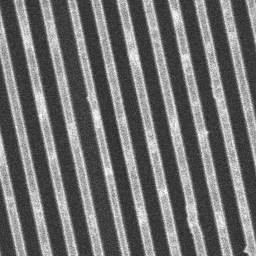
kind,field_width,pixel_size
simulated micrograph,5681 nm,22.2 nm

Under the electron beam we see parallel lines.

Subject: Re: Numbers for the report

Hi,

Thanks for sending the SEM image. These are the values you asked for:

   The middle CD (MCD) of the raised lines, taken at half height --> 244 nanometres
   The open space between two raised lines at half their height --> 317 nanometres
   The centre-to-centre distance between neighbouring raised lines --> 559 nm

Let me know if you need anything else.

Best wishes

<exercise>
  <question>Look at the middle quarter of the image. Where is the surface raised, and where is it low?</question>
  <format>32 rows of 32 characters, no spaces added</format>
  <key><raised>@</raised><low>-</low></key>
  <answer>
----@@@---@@@----@@----@@@---@@@
----@@@---@@@----@@@---@@@----@@
-----@@---@@@----@@@---@@@----@@
@----@@----@@@---@@@----@@----@@
@----@@@---@@@---@@@----@@@---@@
@----@@@---@@@----@@@---@@@---@@
@-----@@---@@@----@@@---@@@----@
@@----@@----@@----@@@---@@@----@
@@----@@----@@----@@@----@@@---@
@@----@@----@@@---@@@----@@@---@
@@----@@@---@@@----@@@---@@@----
@@-----@@---@@@----@@@---@@@----
@@-----@@----@@----@@@----@@----
@@@----@@@---@@@---@@@----@@----
@@@----@@@---@@@---@@@----@@@---
@@@----@@@---@@@----@@@---@@@---
-@@-----@@---@@@----@@@---@@@---
-@@@----@@----@@----@@@----@@---
-@@@----@@@---@@@---@@@----@@@--
-@@@----@@@---@@@----@@----@@@--
-@@@-----@@---@@@----@@@---@@@--
--@@@----@@----@@----@@@---@@@--
--@@@----@@----@@----@@@----@@--
--@@@----@@@---@@@---@@@----@@@-
--@@@----@@@---@@@----@@@---@@@-
---@@-----@@---@@@----@@@---@@@-
---@@@----@@----@@----@@@----@@-
---@@@----@@----@@@---@@@----@@-
---@@@----@@@---@@@---@@@----@@@
---@@@----@@@---@@@----@@@---@@@
----@@-----@@---@@@----@@@---@@@
----@@@----@@----@@@---@@@----@@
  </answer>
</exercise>